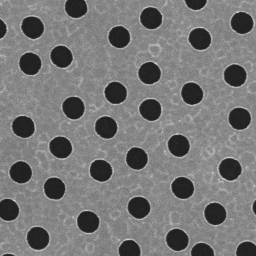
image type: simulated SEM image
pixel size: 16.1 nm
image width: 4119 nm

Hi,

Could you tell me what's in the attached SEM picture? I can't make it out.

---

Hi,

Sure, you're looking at a regular array of holes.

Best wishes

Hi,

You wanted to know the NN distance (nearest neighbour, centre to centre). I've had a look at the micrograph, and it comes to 666 nm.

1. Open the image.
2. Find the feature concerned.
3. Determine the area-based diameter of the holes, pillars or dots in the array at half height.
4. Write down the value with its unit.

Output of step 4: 22.5 pixels